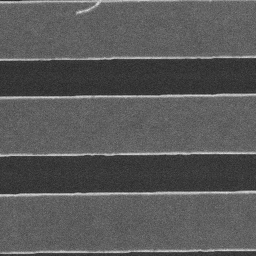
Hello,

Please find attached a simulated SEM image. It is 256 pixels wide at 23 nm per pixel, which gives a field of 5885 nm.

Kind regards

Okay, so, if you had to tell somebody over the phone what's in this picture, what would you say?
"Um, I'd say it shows lines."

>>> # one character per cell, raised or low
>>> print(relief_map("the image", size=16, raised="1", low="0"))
1111111111111111
1111111111111111
1111111111111111
1111111111111111
0000000000000000
0000000000000000
1111111111111111
1111111111111111
1111111111111111
1111111111111111
0000000000000000
0000000000000000
1111111111111111
1111111111111111
1111111111111111
1111111111111111